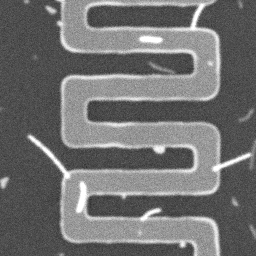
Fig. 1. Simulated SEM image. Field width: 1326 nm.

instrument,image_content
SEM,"groups of lines, slits or small figures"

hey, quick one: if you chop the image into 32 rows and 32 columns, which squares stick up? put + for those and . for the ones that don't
........+++++.++++++++++++......
........+++.....................
........+++.....................
........++++...++...............
........+++++++++++++++++++.....
........+++++++++++++++++++.....
...........++.++.......++++.....
........................+++.....
........................+++.....
.......................++++.....
........+++++++++++++++++++.....
........+++++++++++++++++++.....
........+++.....................
........+++.....................
........+++.....................
........++++++..++++++++++......
........+++++++++++++++++++.....
........+++++++++++++++++++.....
...................++...+++.....
........................+++.....
........................++++....
.........++++++++++++++++++.....
........+++++++++++++++++++.....
........+++++++++++++++++++.....
........+++.....................
........+++.....................
........+++.....................
........++++++++++++++++++......
........+++++++++++++++++++.....
........+++++++++++++++++++.....
........................+++.....
........................+++.....